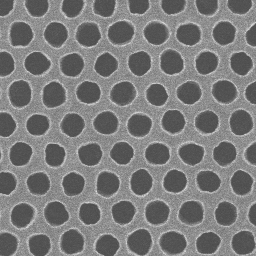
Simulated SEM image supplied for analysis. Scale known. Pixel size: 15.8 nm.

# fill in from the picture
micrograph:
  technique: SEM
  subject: a regular array of holes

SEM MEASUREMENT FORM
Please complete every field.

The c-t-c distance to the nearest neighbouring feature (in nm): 518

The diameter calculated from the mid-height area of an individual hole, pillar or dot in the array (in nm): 358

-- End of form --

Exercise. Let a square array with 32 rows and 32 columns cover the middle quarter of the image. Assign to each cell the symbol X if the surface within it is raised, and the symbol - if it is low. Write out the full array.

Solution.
-----XXX-----XXX------XX------XX
-----XXX-----XXX-----XXXX----XXX
----XXXXX---XXXXXX--XXXXXX-XXXXX
XXXXXXXXXXXXXXXXXXXXXXXXXXXXXXXX
XXXXX--XXXXXXX--XXXXXXXXXXXXXXXX
XXXX-----XXXX----XXXXX---XXXX---
XXX------XXX-----XXXX----XXX----
XXX------XXX------XXX-----XX----
XXXX-----XXX-----XXXX-----XXX---
XXXXX---XXXXX----XXXX----XXXXX--
XXXXXXXXXXXXXXXXXXXXXXX-XXXXXXXX
XXXXXXXXXXXXXXXXXXXXXXXXXX--XXXX
XX-XXXXXX---XXXXXXXXXXXXX----XXX
----XXXX-----XXXX----XXXX-----XX
-----XXX-----XXX------XXX-----XX
-----XXX-----XXX------XXX-----XX
-----XXX-----XXX-----XXXX----XXX
----XXXXXX--XXXXX---XXXXXXXXXXXX
XXXXXXXXXXXXXXXXXXXXXXXXXXXXXXXX
XXXXXXXXXXXXXX-XXXXXXXXXXXXXXXXX
XXXXX----XXX-----XXXX----XXXXX--
XXXX-----XXX-----XXX------XXX---
XXXX------XX------XX------XXX---
XXXX-----XXX-----XXXX-----XXX---
XXXX----XXXXX---XXXXX----XXXXX--
XXXXXX-XXXXXXXXXXXXXXXXXXXXXXXXX
XXXXXXXXXXXXXXXXXXX-XXXXXXX-XXXX
X--XXXXXX---XXXXX----XXXXX----XX
-----XXXX----XXXX-----XXX------X
-----XXX------XXX-----XXX------X
-----XXX------XXX-----XXX-----XX
-----XXX-----XXXX----XXXXX----XX